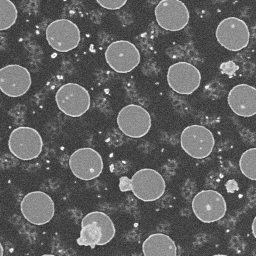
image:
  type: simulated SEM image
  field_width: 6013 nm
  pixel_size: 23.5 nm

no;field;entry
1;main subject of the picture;a regular array of raised bodies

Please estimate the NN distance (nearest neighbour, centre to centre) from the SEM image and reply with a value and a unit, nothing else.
1500 nm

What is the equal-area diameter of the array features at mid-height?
765 nanometres